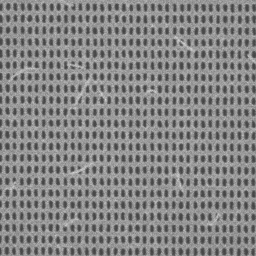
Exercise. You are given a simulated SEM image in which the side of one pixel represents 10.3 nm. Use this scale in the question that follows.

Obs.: a regular array of holes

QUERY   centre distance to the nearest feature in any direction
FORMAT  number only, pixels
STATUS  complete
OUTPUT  6.91